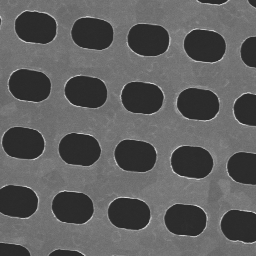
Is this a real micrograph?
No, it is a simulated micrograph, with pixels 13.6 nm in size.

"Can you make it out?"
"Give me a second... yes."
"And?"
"a regular array of holes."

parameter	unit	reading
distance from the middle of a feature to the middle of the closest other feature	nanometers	769